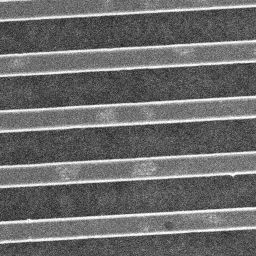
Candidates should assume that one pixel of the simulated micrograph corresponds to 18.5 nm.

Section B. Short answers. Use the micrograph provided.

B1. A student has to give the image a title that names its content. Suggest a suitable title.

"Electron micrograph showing parallel lines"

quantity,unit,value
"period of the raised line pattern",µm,1.03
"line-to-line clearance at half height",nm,644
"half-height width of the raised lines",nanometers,376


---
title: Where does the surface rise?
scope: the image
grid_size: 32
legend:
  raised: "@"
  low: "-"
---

@@@@@@@@@@@@@@@@@@@@@@@@@@@@@@@@
@@@@@@@@@@@@@@@@@@@-------------
@@------------------------------
--------------------------------
--------------------------------
-------------------------@@@@@@@
-------@@@@@@@@@@@@@@@@@@@@@@@@@
@@@@@@@@@@@@@@@@@@@@@@@@@@@@@@@@
@@@@@@@@@@@@@@@@@@--------------
--------------------------------
--------------------------------
--------------------------------
-------------------------@@@@@@@
--------@@@@@@@@@@@@@@@@@@@@@@@@
@@@@@@@@@@@@@@@@@@@@@@@@@@@@@@@@
@@@@@@@@@@@@@@@@----------------
--------------------------------
--------------------------------
--------------------------------
-----------------------@@@@@@@@@
------@@@@@@@@@@@@@@@@@@@@@@@@@@
@@@@@@@@@@@@@@@@@@@@@@@@@@@@@@@@
@@@@@@@@@@@@@@@@----------------
--------------------------------
--------------------------------
--------------------------------
-----------------------@@@@@@@@@
------@@@@@@@@@@@@@@@@@@@@@@@@@@
@@@@@@@@@@@@@@@@@@@@@@@@@@@@@@@@
@@@@@@@@@@@@@@------------------
--------------------------------
--------------------------------